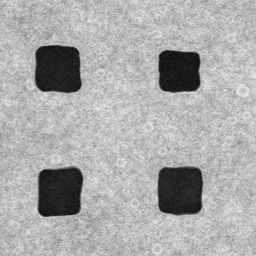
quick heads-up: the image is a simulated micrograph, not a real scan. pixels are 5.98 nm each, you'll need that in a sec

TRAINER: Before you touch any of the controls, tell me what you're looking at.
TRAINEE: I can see holes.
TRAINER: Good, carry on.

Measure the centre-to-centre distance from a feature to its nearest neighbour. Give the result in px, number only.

120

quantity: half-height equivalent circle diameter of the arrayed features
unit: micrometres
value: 0.298